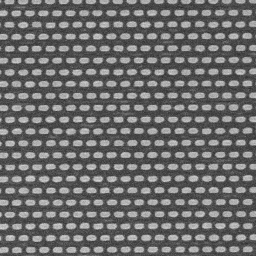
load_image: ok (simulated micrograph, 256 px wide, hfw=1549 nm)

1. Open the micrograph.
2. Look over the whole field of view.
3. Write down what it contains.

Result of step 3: a regular array of raised bodies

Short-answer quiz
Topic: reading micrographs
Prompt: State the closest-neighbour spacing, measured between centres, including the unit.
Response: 80.2 nm